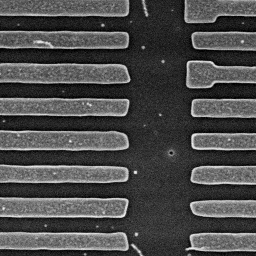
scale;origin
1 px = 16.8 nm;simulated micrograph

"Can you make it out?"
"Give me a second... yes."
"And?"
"wiring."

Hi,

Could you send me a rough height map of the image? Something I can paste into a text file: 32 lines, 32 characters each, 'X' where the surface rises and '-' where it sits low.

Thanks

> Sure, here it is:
XXXXXXXXXXXXXXXX-------XXXXXXXXX
XXXXXXXXXXXXXXXX-------XXXXXXXXX
-----------------------XXXX-----
--------------------------------
XXXXXXXXXXXXXXXX--------XXXXXXXX
XXXXXXXXXXXXXXXX--------XXXXXXXX
--------------------------------
--------------------------------
XXXXXXXXXXXXXXXX-------XXXXXXXXX
XXXXXXXXXXXXXXXX-------XXXXXXXXX
------------------------XXX-----
--------------------------------
XXXXXXXXXXXXXXXX--------XXXXXXXX
XXXXXXXXXXXXXXXX--------XXXXXXXX
------------------------XXXXXXXX
--------------------------------
X--XX---------------------------
XXXXXXXXXXXXXXXX--------XXXXXXXX
XXXXXXXXXXX---X----------XXXXXXX
--------------------------------
--------------------------------
XXXXXXXXXXXXXXXX--------XXXXXXXX
XXXXXXXXXXXXXXX---------XXXXXXXX
--------------------------------
--------------------------------
XXXXXXXXXXXXXXXX--------XXXXXXXX
XXXXXXXXXXXXXXXX--------XXXXXXXX
--------------------------------
--------------------------------
XXXXXXXXXXXXXXX---------XXXXXXXX
XXXXXXXXXXXXXXXX--------XXXXXXXX
--------------------------------